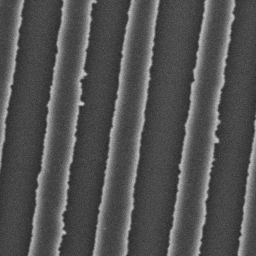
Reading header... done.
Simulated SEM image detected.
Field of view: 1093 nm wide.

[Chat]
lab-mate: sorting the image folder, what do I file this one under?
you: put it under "lines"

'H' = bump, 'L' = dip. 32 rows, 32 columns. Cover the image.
HHHLLLLLHHHHLLLLHHHHLLLLLLHHHLLL
HHHLLLLLHHHLLLLLHHHHLLLLLLHHHLLL
HHHLLLLLHHHLLLLLHHHHLLLLLHHHHLLL
HHLLLLLLHHHLLLLLHHHLLLLLLHHHHLLL
HHLLLLLHHHHLLLLLHHHLLLLLLHHHHLLL
HHLLLLLHHHHLLLLLHHHLLLLLLHHHHLLL
HHLLLLLHHHHLLLLHHHHLLLLLLHHHLLLL
HHLLLLLHHHHLLLLHHHHLLLLLLHHHLLLL
HHLLLLLHHHLLLLLHHHHLLLLLHHHHLLLL
HHLLLLLHHHLLLLLHHHHLLLLLHHHHLLLL
HLLLLLHHHHLLLLLHHHHLLLLLHHHHLLLL
HLLLLLHHHHLLLLLHHHLLLLLLHHHHLLLL
HLLLLLHHHHLLLLLHHHLLLLLLHHHHLLLL
HLLLLLHHHHLLLLHHHHLLLLLLHHHLLLLL
HLLLLLHHHHLLLLHHHHLLLLLLHHHLLLLL
HLLLLLHHHHLLLLHHHHLLLLLHHHHLLLLL
HLLLLLHHHLLLLLHHHHLLLLLHHHHLLLLL
HLLLLLHHHLLLLLHHHHLLLLLHHHHLLLLL
LLLLLHHHHLLLLLHHHLLLLLLHHHHLLLLL
LLLLLHHHHLLLLLHHHLLLLLLHHHHLLLLH
LLLLLHHHHLLLLHHHHLLLLLHHHHLLLLLH
LLLLLHHHHLLLLHHHHLLLLLHHHHLLLLLH
LLLLLHHHHLLLLHHHHLLLLLHHHHLLLLLH
LLLLLHHHHLLLLHHHHLLLLLHHHHLLLLLH
LLLLLHHHLLLLLHHHHLLLLLHHHHLLLLLH
LLLLLHHHLLLLLHHHHLLLLLHHHHLLLLLH
LLLLHHHHLLLLHHHHLLLLLLHHHHLLLLHH
LLLLHHHHLLLLHHHHLLLLLLHHHHLLLLHH
LLLLHHHHLLLLHHHHLLLLLHHHHLLLLLHH
LLLLHHHHLLLLHHHHLLLLLHHHHLLLLLHH
LLLLHHHHLLLLHHHHLLLLLHHHHLLLLLHH
LLLLHHHLLLLLHHHHLLLLLHHHHLLLLLHH